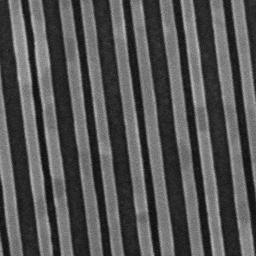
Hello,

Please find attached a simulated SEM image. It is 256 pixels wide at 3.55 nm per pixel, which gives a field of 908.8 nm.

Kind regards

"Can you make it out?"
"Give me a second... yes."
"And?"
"parallel lines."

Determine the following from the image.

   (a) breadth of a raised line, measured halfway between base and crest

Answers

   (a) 41.8 nm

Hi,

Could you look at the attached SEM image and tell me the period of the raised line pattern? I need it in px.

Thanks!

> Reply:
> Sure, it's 25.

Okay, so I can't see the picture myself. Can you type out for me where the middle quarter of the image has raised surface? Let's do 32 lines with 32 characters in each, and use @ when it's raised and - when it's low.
-@@@--@@@-----@@---@@@----@@@--@
-@@@--@@@-----@@---@@@----@@@---
-@@@--@@@-----@@@--@@@----@@@---
-@@@---@@-----@@@--@@@-----@@---
-@@@---@@-----@@@--@@@-----@@---
--@@---@@@----@@@--@@@-----@@@--
--@@---@@@----@@@--@@@-----@@@--
--@@@--@@@----@@@---@@-----@@@--
--@@@--@@@-----@@---@@@----@@@--
--@@@--@@@-----@@---@@@----@@@--
--@@@---@@-----@@@--@@@----@@@--
--@@@---@@-----@@@--@@@-----@@--
--@@@---@@-----@@@--@@@-----@@--
---@@---@@@----@@@--@@@-----@@@-
---@@---@@@----@@@--@@@-----@@@-
---@@@--@@@----@@@---@@-----@@@-
---@@@--@@@-----@@---@@@----@@@-
---@@@--@@@-----@@---@@@----@@@-
---@@@---@@-----@@@--@@@----@@@-
---@@@---@@-----@@@--@@@-----@@-
---@@@---@@-----@@@--@@@-----@@-
----@@---@@@----@@@--@@@-----@@@
----@@---@@@----@@@--@@@-----@@@
----@@@--@@@----@@@---@@-----@@@
----@@@--@@@-----@@---@@@----@@@
----@@@--@@@-----@@---@@@----@@@
----@@@---@@-----@@@--@@@----@@@
----@@@---@@-----@@@--@@@-----@@
----@@@---@@-----@@@--@@@-----@@
-----@@---@@@----@@@--@@@-----@@
-----@@---@@@----@@@--@@@-----@@
-----@@@--@@@----@@@---@@-----@@